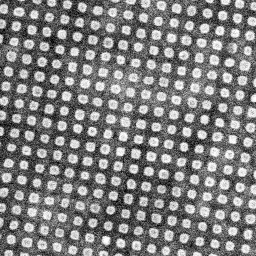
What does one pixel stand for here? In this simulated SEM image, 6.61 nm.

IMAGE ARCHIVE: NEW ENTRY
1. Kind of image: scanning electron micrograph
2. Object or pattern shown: a regular array of raised bodies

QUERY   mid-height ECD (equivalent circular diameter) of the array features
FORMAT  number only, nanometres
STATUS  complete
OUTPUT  56.8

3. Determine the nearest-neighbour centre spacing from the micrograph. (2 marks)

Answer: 97.8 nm